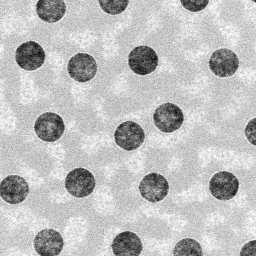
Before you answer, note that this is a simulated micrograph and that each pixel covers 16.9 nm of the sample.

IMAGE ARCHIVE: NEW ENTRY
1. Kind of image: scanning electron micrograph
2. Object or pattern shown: a regular array of holes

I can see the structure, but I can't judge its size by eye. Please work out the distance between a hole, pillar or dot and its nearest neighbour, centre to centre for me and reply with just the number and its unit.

1000 nm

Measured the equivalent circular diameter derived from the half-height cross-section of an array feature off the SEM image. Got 519 nm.